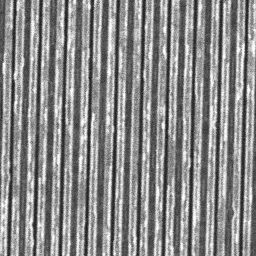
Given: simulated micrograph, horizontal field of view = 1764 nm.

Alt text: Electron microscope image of parallel lines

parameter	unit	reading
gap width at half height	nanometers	32.7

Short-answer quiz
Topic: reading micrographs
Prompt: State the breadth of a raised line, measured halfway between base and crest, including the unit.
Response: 7.5 px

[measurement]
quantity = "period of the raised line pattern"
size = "0.0885 microns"